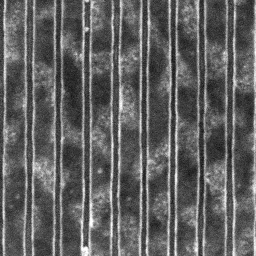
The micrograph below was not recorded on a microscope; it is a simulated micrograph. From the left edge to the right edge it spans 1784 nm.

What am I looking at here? parallel lines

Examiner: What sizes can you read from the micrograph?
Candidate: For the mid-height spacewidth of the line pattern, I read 0.0418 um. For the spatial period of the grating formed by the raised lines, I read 200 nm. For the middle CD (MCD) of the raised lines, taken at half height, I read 155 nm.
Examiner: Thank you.